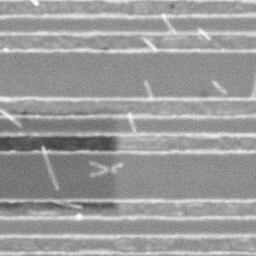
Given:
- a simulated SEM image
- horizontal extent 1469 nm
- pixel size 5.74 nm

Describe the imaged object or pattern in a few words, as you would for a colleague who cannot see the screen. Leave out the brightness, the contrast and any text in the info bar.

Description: lines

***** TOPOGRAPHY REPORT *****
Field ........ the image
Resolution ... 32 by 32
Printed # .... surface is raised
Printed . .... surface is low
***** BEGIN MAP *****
................................
................................
################################
################################
.....................#..........
................................
################################
################################
################################
################################
################################
################################
................................
................................
#####......######...##.#...#####
################################
################################
...#............###.............
...#...........##...............
################################
################################
################################
################################
################################
################################
....#...........................
....###.........................
################################
################################
###############################.
...............#................
...#...........##...#.........#.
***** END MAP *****